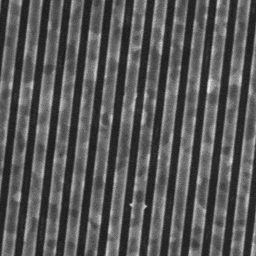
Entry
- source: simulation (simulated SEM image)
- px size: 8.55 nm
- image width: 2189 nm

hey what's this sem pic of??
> parallel lines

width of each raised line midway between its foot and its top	102	nm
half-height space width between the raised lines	78.6	nm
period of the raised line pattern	0.176	micrometres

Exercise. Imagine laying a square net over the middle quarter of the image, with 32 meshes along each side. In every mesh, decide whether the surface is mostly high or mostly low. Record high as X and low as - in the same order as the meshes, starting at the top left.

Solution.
XXX---XX---XX---XXX--XXX--XXX--X
XXX--XXX---XX---XXX--XXX--XXX--X
XXX--XXX--XXX---XXX--XXX--XXX--X
XXX--XXX--XXX---XX---XXX--XXX--X
XXX--XXX--XXX--XXX---XX---XXX--X
XXX--XXX--XXX--XXX--XXX---XXX--X
XX---XX---XXX--XXX--XXX---XX---X
XX---XX---XXX--XXX--XXX---XX---X
XX---XX---XXX--XXX--XXX--XXX--XX
XX---XX---XX---XXX--XXX--XXX--XX
XX--XXX--XXX---XXX--XXX--XXX--XX
XX--XXX--XXX---XXX--XXX--XXX--XX
XX--XXX--XXX---XX---XX---XXX--XX
XX--XXX--XXX--XXX---XX---XXX--XX
X---XXX--XXX--XXX--XXX---XXX--XX
X---XX---XXX--XXX--XXX---XX---XX
X---XX---XXX--XXX--XXX---XX---XX
X---XX---XXX--XXX--XXX--XXX--XXX
X---XX---XX---XXX--XXX--XXX--XXX
X--XXX--XXX---XXX--XXX--XXX--XXX
X--XXX--XXX---XXX--XXX--XXX--XXX
X--XXX--XXX---XX---XX---XXX--XXX
X--XXX--XXX--XXX---XX---XXX--XXX
---XXX--XXX--XXX--XXX---XXX--XXX
---XX---XXX--XXX--XXX---XX---XXX
---XX---XXX--XXX--XXX--XXX---XX-
---XX---XXX--XXX--XXX--XXX--XXX-
--XXX---XX---XXX--XXX--XXX--XXX-
--XXX--XXX---XXX--XXX--XXX--XXX-
--XXX--XXX---XX---XXX--XXX--XXX-
--XXX--XXX---XX---XX---XXX--XXX-
--XXX--XXX--XXX---XX---XX---XXX-